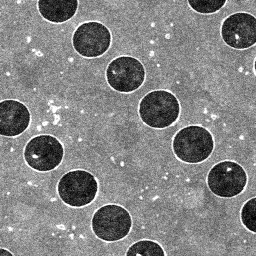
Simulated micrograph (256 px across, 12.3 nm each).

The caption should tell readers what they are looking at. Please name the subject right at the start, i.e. a regular array of holes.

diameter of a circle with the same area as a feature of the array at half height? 476 nm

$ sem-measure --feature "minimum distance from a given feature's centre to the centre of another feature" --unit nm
599